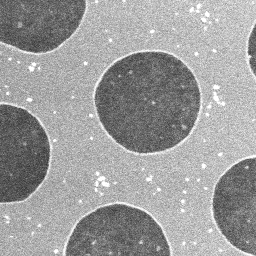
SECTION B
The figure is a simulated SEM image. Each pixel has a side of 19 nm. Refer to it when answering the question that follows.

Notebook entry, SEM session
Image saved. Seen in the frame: holes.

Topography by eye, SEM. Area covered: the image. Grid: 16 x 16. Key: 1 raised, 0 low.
0000011111111111
0000011111111111
0000111111111111
1111111100011111
1111111000001111
1111110000001111
1111110000000111
0011110000001111
0001111000001111
0001111100111111
0001111111111100
0001111111111100
0111111111111000
1111100001111000
1111000000111100
1111000000011110